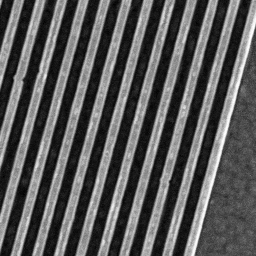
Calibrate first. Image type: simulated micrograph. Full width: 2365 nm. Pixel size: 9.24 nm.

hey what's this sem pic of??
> parallel lines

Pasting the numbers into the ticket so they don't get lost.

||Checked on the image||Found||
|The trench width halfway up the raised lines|116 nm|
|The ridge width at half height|77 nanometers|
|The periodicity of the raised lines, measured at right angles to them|193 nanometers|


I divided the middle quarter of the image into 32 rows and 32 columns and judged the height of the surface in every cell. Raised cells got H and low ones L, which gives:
HLLLLHHLLLHHLLLLHHLLLHHLLLHHHLLL
HLLLLHHLLLHHLLLHHLLLLHHLLLHHLLLL
HLLLHHLLLLHHLLLHHLLLLHHLLLHHLLLH
HLLLHHLLLHHHLLLHHLLLHHLLLLHHLLLH
LLLLHHLLLHHLLLLHHLLLHHLLLHHHLLLH
LLLHHHLLLHHLLLHHLLLLHHLLLHHHLLLH
LLLHHHLLLHHLLLHHLLLHHHLLLHHLLLHH
LLLHHLLLHHLLLLHHLLLHHLLLLHHLLLHH
LLLHHLLLHHLLLLHHLLLHHLLLHHLLLLHH
LLHHHLLLHHLLLHHLLLLHHLLLHHLLLLHH
LLHHLLLLHHLLLHHLLLLHHLLLHHLLLHHL
LLHHLLLHHLLLLHHLLLHHLLLLHHLLLHHL
LLHHLLLHHLLLHHHLLLHHLLLHHLLLLHHL
LHHLLLLHHLLLHHLLLLHHLLLHHLLLHHHL
LHHLLLHHHLLLHHLLLLHLLLLHHLLLHHLL
LHHLLLHHLLLLHHLLLHHLLLLHHLLLHHLL
LHHLLLHHLLLHHLLLLHHLLLHHLLLLHHLL
HHLLLLHHLLLHHLLLLHHLLLHHLLLHHHLL
HHLLLHHHLLLHHLLLHHLLLLHHLLLHHLLL
HHLLLHHLLLLHHLLLHHLLLHHHLLLHHLLL
HHLLLHHLLLHHLLLLHHLLLHHLLLLHHLLL
HLLLLHHLLLHHLLLLHHLLLHHLLLHHLLLL
HLLLHHLLLLHHLLLHHLLLLHHLLLHHLLLH
HLLLHHLLLLHHLLLHHLLLLHLLLLHHLLLH
HLLLHHLLLHHLLLLHHLLLHHLLLLHHLLLH
LLLLHHLLLHHLLLLHHLLLHHLLLHHLLLLH
LLLHHLLLLHHLLLHHLLLLHHLLLHHLLLHH
LLLHHLLLHHHLLLHHLLLHHLLLLHHLLLHH
LLLHHLLLHHLLLLHHLLLHHLLLHHHLLLHH
LLHHHLLLHHLLLHHHLLLHHLLLHHLLLLHH
LLHHLLLLHHLLLHHLLLLHHLLLHHLLLHHL
LLHHLLLHHHLLLHHLLLHHLLLLHHLLLHHL